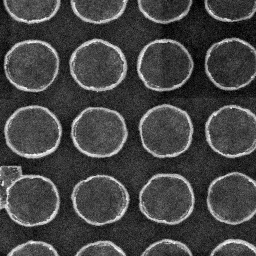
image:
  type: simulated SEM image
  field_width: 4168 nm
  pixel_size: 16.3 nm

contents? a regular array of raised bodies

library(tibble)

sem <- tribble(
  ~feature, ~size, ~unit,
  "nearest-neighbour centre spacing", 1080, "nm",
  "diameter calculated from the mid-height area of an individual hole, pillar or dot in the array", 0.845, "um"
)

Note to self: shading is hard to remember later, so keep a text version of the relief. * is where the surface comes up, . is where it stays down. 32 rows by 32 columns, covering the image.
.******..*******.*******..******
.******..******...*****...******
..****.....***.....***......**..
................................
................................
...***.....***.....***.....****.
.******..******...*****...******
.******..*******.*******..******
.******..*******.*******..******
.******..******...******..******
..****....*****...*****....****.
................................
................................
...**..............***......**..
..*****...*****...*****...******
.******..*******..******..******
.*******.*******..******..******
.******..*******..******..******
.******...*****...*****....*****
...**.......**......**......**..
................................
**..............................
*.****.....***.....****....*****
*******..******...******..******
*******..*******..******..******
*******..*******..******..******
.******...*****...******..******
..****.....***.....****....****.
................................
................................
...***......**.....****.....***.
.******...*****...******...*****